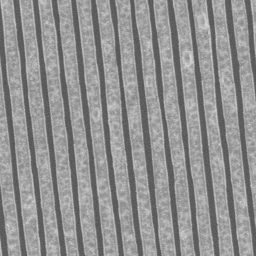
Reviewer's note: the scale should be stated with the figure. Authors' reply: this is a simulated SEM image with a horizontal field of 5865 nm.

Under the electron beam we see parallel lines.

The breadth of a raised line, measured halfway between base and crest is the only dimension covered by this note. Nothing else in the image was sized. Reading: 290 nanometres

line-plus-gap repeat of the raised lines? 439 nm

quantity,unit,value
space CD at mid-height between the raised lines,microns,0.157